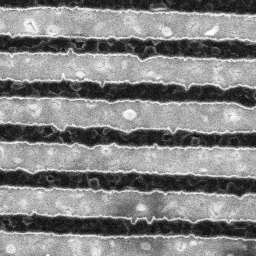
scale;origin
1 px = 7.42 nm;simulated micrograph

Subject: parallel lines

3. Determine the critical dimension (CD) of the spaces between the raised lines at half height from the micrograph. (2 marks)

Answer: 25.6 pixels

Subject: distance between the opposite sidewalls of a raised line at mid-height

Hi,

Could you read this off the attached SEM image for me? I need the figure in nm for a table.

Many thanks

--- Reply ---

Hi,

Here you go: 143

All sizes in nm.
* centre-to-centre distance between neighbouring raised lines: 333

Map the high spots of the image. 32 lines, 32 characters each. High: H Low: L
HHHHHHHHHHHHHHHHHHHHHHHHHHHHHHHH
LLLLLLLLLLLLLLLLLHHHHHHHHHHHHHHH
LLLLLLLLLLLLLLLLLLLLLLLLLLLLLLLL
LLLLLLLLLLLLLLLLLLLLLLLLLLLLLLLL
HHHHHHLHLLLLLLLLLLLLLLLLLLLLLLLL
HHHHHHHHHHHHHHHHHHHHHHHHHHHHHHHH
HHHHHHHHHHHHHHHHHHHHHHHHHHHHHHHH
LLLLLLLLLLLLLLLLLHLLLLLLLLLHHHHH
LLLLLLLLLLLLLLLLLLLLLLLLLLLLLLLL
LLLLLLLLLLLLLLLLLLLLLLLLLLLLLLLL
HHHHHHHHHHHHHHHHHHHHHHHLHLHLLLLL
HHHHHHHHHHHHHHHHHHHHHHHHHHHHHHHH
LLLLLLLLLLLHHHHHHHHHHHHHHHHHHHHH
LLLLLLLLLLLLLLLLLLLLLLLLLLLLLLLH
LLLLLLLLLLLLLLLLHLLLLLLLLLLLLLLL
HHHLLLLLLLLLLLLLLLLLLLLLLLLLLLLL
HHHHHHHHHHHHHHHHHHHHHHHHHHLLHHHH
HHHHHHHHHHHHHHHHHHHHHHHHHHHHHHHH
LLLLLLLLLLLLLLLLHHLLHHLHHHHLHHHH
LLLLLLLLLLLLLLLLLLLLLLLLLLLLLLLL
LLLLLLLLLLLLLLLLLLLLLLLLLLLLLLLL
HHHHHHHHHHHHHHHHHLLLLLLLLLLLLLLL
HHHHHHHHHHHHHHHHHHHHHHHHHHHHHHHH
LLHHHHHHHHHHHHHHHHHHHHHHHHHHHHHH
LLLLLLLLLLLLLLLLLLLLLLLLLLLLLHHL
LLLLLLLLLLLLLLLLLLLLLLLLLLLLLLLL
LLLLLLLLLLLLLLLLLLLLLLLLLLLLLLLL
HHHHHHHHHHHHHHHHHHLHHHHLLHHHLLHL
HHHHHHHHHHHHHHHHHHHHHHHHHHHHHHHH
LLLLLLLHLLLHHHHHHHHHHHHHHHHHHHHH
LLLLLLLLLLLLLLLLLLLLLLLLLLLLLLLL
LLLLLLLLLLLLLLLLLLLLLLLLLLLLLLLL